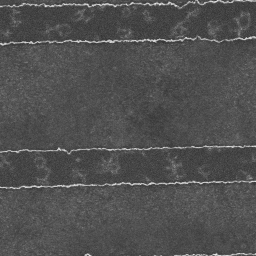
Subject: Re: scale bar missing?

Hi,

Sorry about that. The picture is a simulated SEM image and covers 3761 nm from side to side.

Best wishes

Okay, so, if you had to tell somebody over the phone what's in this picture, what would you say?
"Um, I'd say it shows one or a few lines or trenches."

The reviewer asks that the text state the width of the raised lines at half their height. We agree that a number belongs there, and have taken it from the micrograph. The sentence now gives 540 nm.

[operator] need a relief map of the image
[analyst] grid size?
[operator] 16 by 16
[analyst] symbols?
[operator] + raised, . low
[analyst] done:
++++++++++++++++
++++++++++++++++
+++++++++++..+..
................
................
................
................
................
................
++++++++++++++++
++++++++++++++++
++++++++++......
................
................
................
................